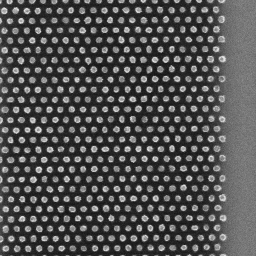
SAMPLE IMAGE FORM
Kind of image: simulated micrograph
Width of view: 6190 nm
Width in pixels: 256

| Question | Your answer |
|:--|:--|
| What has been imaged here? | a regular array of raised bodies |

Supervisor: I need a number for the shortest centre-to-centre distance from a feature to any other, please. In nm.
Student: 262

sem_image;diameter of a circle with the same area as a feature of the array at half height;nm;142